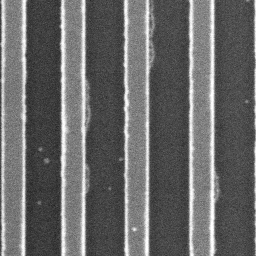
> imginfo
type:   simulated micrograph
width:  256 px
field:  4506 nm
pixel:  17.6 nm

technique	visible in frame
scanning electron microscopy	lines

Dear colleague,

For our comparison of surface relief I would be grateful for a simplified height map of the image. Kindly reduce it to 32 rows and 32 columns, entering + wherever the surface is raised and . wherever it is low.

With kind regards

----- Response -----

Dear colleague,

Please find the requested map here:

+++.....+++.....++......+++.....
+++.....+++.....++......+++.....
+++.....+++.....++......+++.....
+++.....+++.....++......+++.....
+++.....+++.....++......+++.....
+++.....+++.....++......+++.....
+++.....+++.....++......+++.....
+++.....+++.....++......+++.....
+++.....+++.....++......+++.....
+++.....+++.....++......+++.....
+++.....+++.....++......+++.....
+++.....+++.....++......+++.....
+++.....+++.....++......+++.....
+++.....+++.....++......+++.....
+++.....+++.....++......+++.....
+++.....+++.....++......+++.....
+++.....+++.....++......+++.....
+++.....+++.....++......+++.....
+++.....+++.....++......+++.....
+++.....+++.....++......+++.....
+++.....+++.....++......+++.....
+++.....+++.....++......+++.....
+++.....+++.....++......+++.....
+++.....+++.....++......+++.....
+++.....+++.....++......+++.....
+++.....+++.....++......+++.....
+++.....+++.....++......+++.....
+++.....+++.....++......+++.....
+++.....+++.....++......+++.....
+++.....+++.....++......+++.....
+++.....+++.....++......+++.....
+++.....+++.....++......+++.....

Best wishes